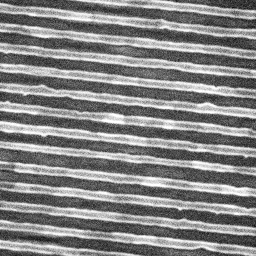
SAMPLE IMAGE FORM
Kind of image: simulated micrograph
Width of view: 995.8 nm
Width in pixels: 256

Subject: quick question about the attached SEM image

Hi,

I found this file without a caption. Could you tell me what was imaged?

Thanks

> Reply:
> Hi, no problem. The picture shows parallel lines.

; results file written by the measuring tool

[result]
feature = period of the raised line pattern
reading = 76.3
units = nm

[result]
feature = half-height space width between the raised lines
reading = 45.9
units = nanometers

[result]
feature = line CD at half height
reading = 30.5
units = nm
